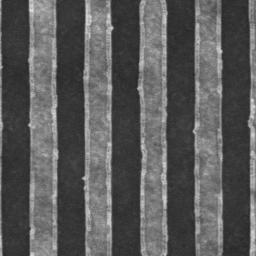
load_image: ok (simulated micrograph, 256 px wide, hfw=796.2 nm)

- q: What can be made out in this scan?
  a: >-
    parallel lines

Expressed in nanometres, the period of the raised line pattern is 171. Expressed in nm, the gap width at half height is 92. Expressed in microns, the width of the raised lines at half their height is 0.08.